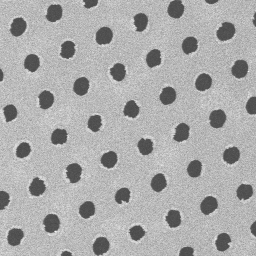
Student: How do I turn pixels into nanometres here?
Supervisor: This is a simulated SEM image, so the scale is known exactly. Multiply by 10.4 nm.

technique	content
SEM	a regular array of holes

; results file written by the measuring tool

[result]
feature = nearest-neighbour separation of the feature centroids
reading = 397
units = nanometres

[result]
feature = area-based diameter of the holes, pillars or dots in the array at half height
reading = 175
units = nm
